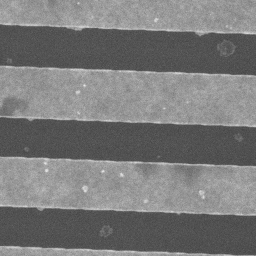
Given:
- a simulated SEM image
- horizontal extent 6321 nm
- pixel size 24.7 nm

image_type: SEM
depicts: lines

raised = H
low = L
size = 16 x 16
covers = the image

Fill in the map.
HHHHHHHHHHHHHHHH
HHHHHHHHHHHHHHHH
LLLLLLLLLLLLLLLL
LLLLLLLLLLLLLLLL
HHHHHHHHHHLLLLLL
HHHHHHHHHHHHHHHH
HHHHHHHHHHHHHHHH
LLLLHHHHHHHHHHHH
LLLLLLLLLLLLLLLL
LLLLLLLLLLLLLLLL
HHHHHHHHHHHHHHHH
HHHHHHHHHHHHHHHH
HHHHHHHHHHHHHHHH
LLLLLLLLLLLLLLLL
LLLLLLLLLLLLLLLL
HHHLLLLLLLLLLLLL